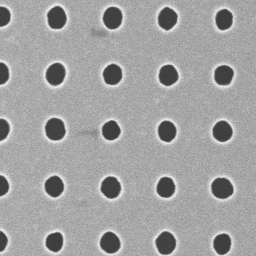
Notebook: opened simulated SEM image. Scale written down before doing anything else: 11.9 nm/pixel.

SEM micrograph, a regular array of holes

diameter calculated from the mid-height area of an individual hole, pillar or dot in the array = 20.5 px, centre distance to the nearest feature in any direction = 0.658 um